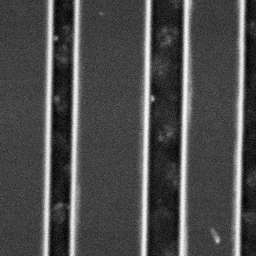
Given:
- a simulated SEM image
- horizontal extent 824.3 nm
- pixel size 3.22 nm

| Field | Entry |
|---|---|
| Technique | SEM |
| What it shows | one or a few lines or trenches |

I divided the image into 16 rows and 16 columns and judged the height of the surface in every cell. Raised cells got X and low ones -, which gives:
XXX--XXXX---XXX-
XXX--XXXX---XXX-
XXX--XXXX---XXX-
XXX--XXXX---XXX-
XXX--XXXX---XXX-
XXX--XXXX---XXX-
XXX--XXXX---XXX-
XXX--XXXX---XXX-
XXX--XXXX---XXX-
XXX--XXXX---XXX-
XXX--XXXX--XXXX-
XXX--XXXX--XXXX-
XXX--XXXX--XXXX-
XXX--XXXX--XXXX-
XXX--XXXX--XXXX-
XXX--XXXX--XXXX-